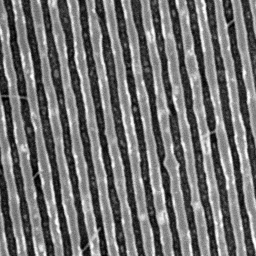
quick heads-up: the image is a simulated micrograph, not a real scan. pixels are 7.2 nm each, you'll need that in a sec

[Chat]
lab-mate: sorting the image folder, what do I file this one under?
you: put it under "parallel lines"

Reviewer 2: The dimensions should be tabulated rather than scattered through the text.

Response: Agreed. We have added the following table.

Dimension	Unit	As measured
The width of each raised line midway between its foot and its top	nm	71.9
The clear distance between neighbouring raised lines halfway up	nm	59.5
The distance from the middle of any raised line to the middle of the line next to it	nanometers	130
